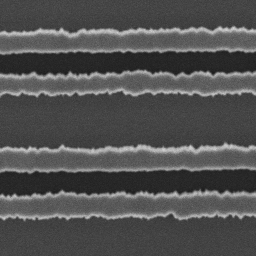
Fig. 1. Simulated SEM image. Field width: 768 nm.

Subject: lines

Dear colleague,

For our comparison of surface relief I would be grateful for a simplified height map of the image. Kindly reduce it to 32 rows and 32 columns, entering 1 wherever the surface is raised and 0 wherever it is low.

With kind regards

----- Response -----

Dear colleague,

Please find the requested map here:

00000000000000000000000000000000
00000000000000000000000000000000
00000000000000000000000000000000
00000000000000000000000000010000
11111111111111111111111111111111
11111111111111111111111111111111
11111111000111010000101000000000
00000000000000000000000000000000
00000000000000000000000000000000
11111111111111111111111111111111
11111111111111111111111111111111
11111111111111111111111111111111
00000000000000000000000000000000
00000000000000000000000000000000
00000000000000000000000000000000
00000000000000000000000000000000
00000000000000000000000000000000
00000000000000000000000000000000
10000101100001011110001101111111
11111111111111111111111111111111
11111111111111111111111111111111
00110000000000000000000000000000
00000000000000000000000000000000
00000000000000000000000000000000
11001111111111111111111111111111
11111111111111111111111111111111
11111111111111111111111111111111
00000000000000000000000000000000
00000000000000000000000000000000
00000000000000000000000000000000
00000000000000000000000000000000
00000000000000000000000000000000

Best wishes